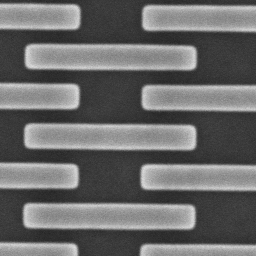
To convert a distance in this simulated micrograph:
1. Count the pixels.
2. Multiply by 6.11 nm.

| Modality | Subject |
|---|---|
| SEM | groups of lines, slits or small figures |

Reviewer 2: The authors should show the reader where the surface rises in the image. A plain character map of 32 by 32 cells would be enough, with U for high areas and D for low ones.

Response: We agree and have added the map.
DDDDDDDDDDDDDDDDDDDDDDDDDDDDDDDD
UUUUUUUUUUDDDDDDDDUUUUUUUUUUUUUU
UUUUUUUUUUDDDDDDDDUUUUUUUUUUUUUU
UUUUUUUUUDDDDDDDDDUUUUUUUUUUUUUU
DDDDDDDDDDDDDDDDDDDDDDDDDDDDDDDD
DDDDDDDDDDDDDDDDDDDDDDDDDDDDDDDD
DDDUUUUUUUUUUUUUUUUUUUUUDDDDDDDD
DDDUUUUUUUUUUUUUUUUUUUUUDDDDDDDD
DDDDUUUUUUUUUUUUUUUUUUUUDDDDDDDD
DDDDDDDDDDDDDDDDDDDDDDDDDDDDDDDD
DDDDDDDDDDDDDDDDDDDDDDDDDDDDDDDD
UUUUUUUUUUDDDDDDDDUUUUUUUUUUUUUU
UUUUUUUUUUDDDDDDDDUUUUUUUUUUUUUU
DDDDDDDUUDDDDDDDDDUUUUUUUUUUUUUU
DDDDDDDDDDDDDDDDDDDDDDDDDDDDDDDD
DDDDDDDDDDDDDDDDDDDDDDDDDDDDDDDD
DDDUUUUUUUUUUUUUUUUUUUUUDDDDDDDD
DDDUUUUUUUUUUUUUUUUUUUUUDDDDDDDD
DDDDDDDDDDDDUUUUUUUUUUUUDDDDDDDD
DDDDDDDDDDDDDDDDDDDDDDDDDDDDDDDD
UUUUUUDDDDDDDDDDDDDDDDDDDDDDDDDD
UUUUUUUUUUDDDDDDDDUUUUUUUUUUUUUU
UUUUUUUUUUDDDDDDDDUUUUUUUUUUUUUU
DDDDDDDUUDDDDDDDDDUUUUUUUUUUUUUU
DDDDDDDDDDDDDDDDDDDDDDDDDDDDDDDD
DDDDDDDDDDDDDDDDDDDDDDDDDDDDDDDD
DDDUUUUUUUUUUUUUUUUUUUUUDDDDDDDD
DDDUUUUUUUUUUUUUUUUUUUUUDDDDDDDD
DDDDDDDDDDDDUUUUUUUUUUUUDDDDDDDD
DDDDDDDDDDDDDDDDDDDDDDDDDDDDDDDD
UUDDDDDDDDDDDDDDDDDDDDDDDDDDDDDD
UUUUUUUUUUDDDDDDDDUUUUUUUUUUUUUU